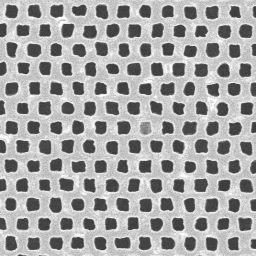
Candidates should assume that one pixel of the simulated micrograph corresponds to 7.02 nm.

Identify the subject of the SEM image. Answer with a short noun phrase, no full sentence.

a regular array of holes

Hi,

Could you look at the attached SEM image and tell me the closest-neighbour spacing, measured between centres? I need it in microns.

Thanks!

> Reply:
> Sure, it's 0.151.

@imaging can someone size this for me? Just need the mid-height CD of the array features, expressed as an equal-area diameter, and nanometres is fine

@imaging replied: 92.1